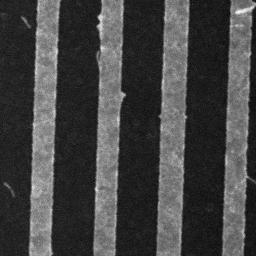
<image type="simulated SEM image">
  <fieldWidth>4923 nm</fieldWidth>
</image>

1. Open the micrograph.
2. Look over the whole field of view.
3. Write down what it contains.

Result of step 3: one or a few lines or trenches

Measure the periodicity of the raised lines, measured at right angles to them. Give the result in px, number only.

64.3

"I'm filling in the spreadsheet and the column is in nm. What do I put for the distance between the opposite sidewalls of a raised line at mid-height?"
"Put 411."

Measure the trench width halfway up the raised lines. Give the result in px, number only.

42.2